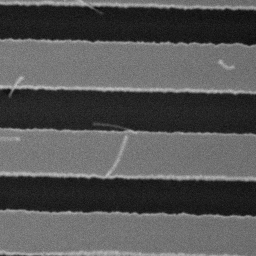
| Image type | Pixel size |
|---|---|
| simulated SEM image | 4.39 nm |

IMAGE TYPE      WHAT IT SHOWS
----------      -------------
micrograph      lines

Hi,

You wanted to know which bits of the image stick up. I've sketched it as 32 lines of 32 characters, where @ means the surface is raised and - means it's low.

@@@@@@@@@@@@@@@@@@@@@@@@@@@@@@@@
--------------------------------
--------------------------------
--------------------------------
--------------------------------
@@@@@@@@@@@@@@@@@@@@@@@@@@@--@--
@@@@@@@@@@@@@@@@@@@@@@@@@@@@@@@@
@@@@@@@@@@@@@@@@@@@@@@@@@@@@@@@@
@@@@@@@@@@@@@@@@@@@@@@@@@@@@@@@@
@@@@@@@@@@@@@@@@@@@@@@@@@@@@@@@@
@@@@@@@@@@@@@@@@@@@@@@@@@@@@@@@@
--------------------@@@@@@@@@@@@
--------------------------------
--------------------------------
--------------------------------
--------------------------------
@@@@@@@@@@@@@@@@@@@@--@---------
@@@@@@@@@@@@@@@@@@@@@@@@@@@@@@@@
@@@@@@@@@@@@@@@@@@@@@@@@@@@@@@@@
@@@@@@@@@@@@@@@@@@@@@@@@@@@@@@@@
@@@@@@@@@@@@@@@@@@@@@@@@@@@@@@@@
@@@@@@@@@@@@@@@@@@@@@@@@@@@@@@@@
--------------------------@-@-@@
--------------------------------
--------------------------------
--------------------------------
@@@@@---@-----------------------
@@@@@@@@@@@@@@@@@@@@@@@@@@@@@@@@
@@@@@@@@@@@@@@@@@@@@@@@@@@@@@@@@
@@@@@@@@@@@@@@@@@@@@@@@@@@@@@@@@
@@@@@@@@@@@@@@@@@@@@@@@@@@@@@@@@
@@@@@@@@@@@@@@@@@@@@@@@@@@@@@@@@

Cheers